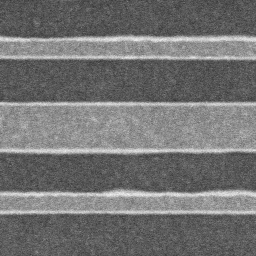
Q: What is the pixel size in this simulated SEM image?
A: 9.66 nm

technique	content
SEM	lines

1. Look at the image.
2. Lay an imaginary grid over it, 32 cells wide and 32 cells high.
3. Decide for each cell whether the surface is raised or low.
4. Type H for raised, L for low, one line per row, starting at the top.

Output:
LLLLLLLLLLLLLLLLLLLLLLLLLLLLLLLL
LLLLLLLLLLLLLLLLLLLLLLLLLLLLLLLL
LLLLLLLLLLLLLLLLLLLLLLLLLLLLLLLL
LLLLLLLLLLLLLLLLLLLLLLLLLLLLLLLL
LLLLLLLLLLLLLLLLLLLLLLLLLLLLLLLL
HHHHHHHHHHHHHHHHHHHHHHHHHHHHHHHH
HHHHHHHHHHHHHHHHHHHHHHHHHHHHHHHH
LLLLLLLLLLLLLLLLLLLLLLLLLLLLLLLL
LLLLLLLLLLLLLLLLLLLLLLLLLLLLLLLL
LLLLLLLLLLLLLLLLLLLLLLLLLLLLLLLL
LLLLLLLLLLLLLLLLLLLLLLLLLLLLLLLL
LLLLLLLLLLLLLLLLLLLLLLLLLLLLLLLL
LLLLLLLLLLLLLLLLLLLLLLLLLLLLLLLL
HHHHHHHHHHHHHHHHHHHHHHHHHHHHHHHH
HHHHHHHHHHHHHHHHHHHHHHHHHHHHHHHH
HHHHHHHHHHHHHHHHHHHHHHHHHHHHHHHH
HHHHHHHHHHHHHHHHHHHHHHHHHHHHHHHH
HHHHHHHHHHHHHHHHHHHHHHHHHHHHHHHH
HHHHHHHHHHHHHHHHHHHHHHHHHHHHHHHH
LLLLLLLLLLLLLLLLLLLLLLLLLLLLLLLL
LLLLLLLLLLLLLLLLLLLLLLLLLLLLLLLL
LLLLLLLLLLLLLLLLLLLLLLLLLLLLLLLL
LLLLLLLLLLLLLLLLLLLLLLLLLLLLLLLL
LLLLLLLLLLLLLLLLLLLLLLLLLLLLLLLL
HHHHHHHHHHHHHHHHHHHHHHHHHHHHHHHH
HHHHHHHHHHHHHHHHHHHHHHHHHHHHHHHH
LLLLLLLLLLLLLLLLLLLLLLLLLLLLLLLL
LLLLLLLLLLLLLLLLLLLLLLLLLLLLLLLL
LLLLLLLLLLLLLLLLLLLLLLLLLLLLLLLL
LLLLLLLLLLLLLLLLLLLLLLLLLLLLLLLL
LLLLLLLLLLLLLLLLLLLLLLLLLLLLLLLL
LLLLLLLLLLLLLLLLLLLLLLLLLLLLLLLL